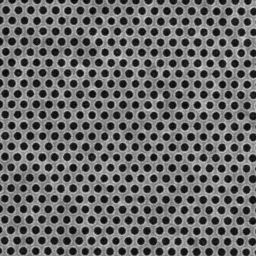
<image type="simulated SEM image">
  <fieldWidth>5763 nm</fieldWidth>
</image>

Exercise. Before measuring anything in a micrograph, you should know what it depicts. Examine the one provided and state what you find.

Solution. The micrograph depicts a regular array of holes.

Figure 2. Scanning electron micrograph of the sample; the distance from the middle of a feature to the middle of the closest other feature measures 12 pixels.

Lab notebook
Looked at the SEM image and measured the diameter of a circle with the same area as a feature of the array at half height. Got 197 nanometres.